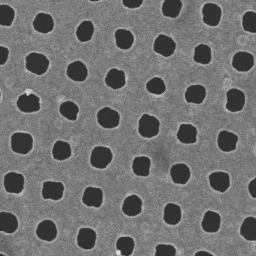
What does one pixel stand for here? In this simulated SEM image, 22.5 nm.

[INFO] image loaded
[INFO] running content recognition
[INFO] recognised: a regular array of holes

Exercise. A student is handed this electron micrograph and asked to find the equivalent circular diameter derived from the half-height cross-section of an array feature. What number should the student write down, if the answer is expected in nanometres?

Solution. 475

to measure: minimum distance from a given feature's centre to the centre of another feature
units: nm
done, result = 896